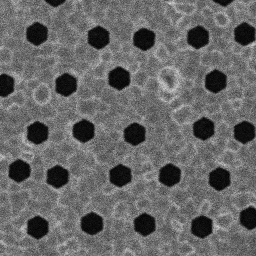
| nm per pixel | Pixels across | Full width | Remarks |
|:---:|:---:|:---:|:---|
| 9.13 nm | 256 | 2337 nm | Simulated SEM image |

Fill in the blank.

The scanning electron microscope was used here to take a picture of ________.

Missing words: a regular array of holes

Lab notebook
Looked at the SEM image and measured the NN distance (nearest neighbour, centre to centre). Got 425 nm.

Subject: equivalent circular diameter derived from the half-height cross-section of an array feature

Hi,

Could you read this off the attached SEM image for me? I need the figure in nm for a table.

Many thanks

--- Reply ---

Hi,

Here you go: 209